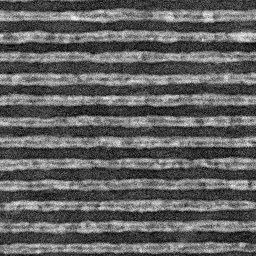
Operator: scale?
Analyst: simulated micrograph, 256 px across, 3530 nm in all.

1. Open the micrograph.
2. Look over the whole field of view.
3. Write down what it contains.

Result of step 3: parallel lines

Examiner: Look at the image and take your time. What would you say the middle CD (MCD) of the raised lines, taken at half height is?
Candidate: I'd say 99.9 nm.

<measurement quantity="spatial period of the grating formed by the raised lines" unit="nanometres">291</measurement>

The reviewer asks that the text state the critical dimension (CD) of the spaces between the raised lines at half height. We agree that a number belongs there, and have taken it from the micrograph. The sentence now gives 188 nanometers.